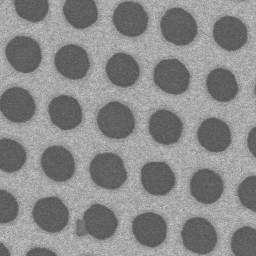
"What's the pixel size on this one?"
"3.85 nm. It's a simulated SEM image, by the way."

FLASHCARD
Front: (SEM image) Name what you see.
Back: a regular array of holes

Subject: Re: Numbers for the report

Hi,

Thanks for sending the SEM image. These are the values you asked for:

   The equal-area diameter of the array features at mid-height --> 137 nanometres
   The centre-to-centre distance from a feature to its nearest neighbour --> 191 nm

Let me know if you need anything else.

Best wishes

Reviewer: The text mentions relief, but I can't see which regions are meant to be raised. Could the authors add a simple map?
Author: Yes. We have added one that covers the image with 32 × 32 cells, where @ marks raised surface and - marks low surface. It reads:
@@----@@----@@@---@@@@@@@@@@@@@@
@@----@@----@@----@@@--@@@@@@@@@
@@@--@@@----@@-----@----@@@---@@
@@@@@@@@@@-@@@----@@-----@@----@
@@-@@@@@@@@@@@@@-@@@----@@@----@
@----@@@@@@@@@@@@@@@@@--@@@----@
@----@@----@@@@@@@@@@@@@@@@@@@@@
@----@@----@@@---@@@--@@@@@@@@@@
@@---@@----@@----@@----@@@@-@@@@
@@@@@@@@---@@----@@-----@@---@@@
@@@@@@@@@@@@@@---@@-----@@----@@
@---@@@@@@@@@@@@@@@@@--@@@----@@
----@@----@@@@@@@@@@@@@@@@@--@@@
----@@----@@@---@@@@@@@@@@@@@@@@
@---@@----@@-----@@---@@@@@@@@@@
@@@@@@@---@@-----@@----@@---@@@@
@@@@@@@@@@@@@----@@----@@----@@-
--@@@@@@@@@@@@@@@@@---@@@----@@-
---@@@--@@@@@@@@@@@@@@@@@@--@@@-
---@@----@@@---@@@@@@@@@@@@@@@@@
---@@----@@----@@@---@@@@@@@@@@@
@-@@@----@@-----@@----@@---@@@@@
@@@@@@@-@@@@----@@----@@----@@--
@@@@@@@@@@@@@--@@@----@@----@@--
--@@@@@@@@@@@@@@@@@@@@@@----@@--
--@@----@@@@@@@@@@@@@@@@@@@@@@--
--@@-----@@---@@@@@@@@@@@@@@@@@@
--@@-----@-----@@----@@@--@@@@@@
@@@@@---@------@@----@@----@@@--
@@@@@@@@@@@---@@@----@@----@@---
@@@@@@@@@@@@@@@@@@--@@@----@@---
-@@----@@@@@@@@@@@@@@@@@--@@@---